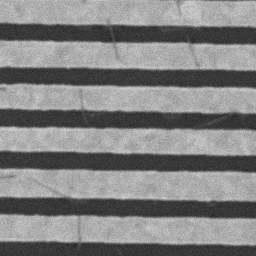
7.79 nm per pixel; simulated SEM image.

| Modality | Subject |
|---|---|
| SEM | lines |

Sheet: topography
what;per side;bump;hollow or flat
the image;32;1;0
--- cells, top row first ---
11111111111111111111111111111111
11111111111111111111111111111111
11111111111111111111111111111111
00000000000000000000000000000000
00000000000000000000000000000000
11111111111111111111111100000000
11111111111111111111111111111111
11111111111111111111111111111111
00000000000000000011111111111111
00000000000000000000000000000000
00000000000000000000000000000000
11111111111111111111111111111111
11111111111111111111111111111111
00111111111111111111111111111111
00000000000000000000000000000000
00000000000000000000000000000000
11111111111111111111111111111111
11111111111111111111111111111111
11111111111111111111111111111111
00000000000000000000000000000000
00000000000000000000000000000000
11111111111111111111000000000000
11111111111111111111111111111111
11111111111111111111111111111111
01111111111111111111111111111111
00000000000000000000000000000000
00000000000000000000000000000000
11111111111111111111111111111111
11111111111111111111111111111111
11111111111111111111111111111111
00000000000000000000000000001111
00000000000000000000000000000000